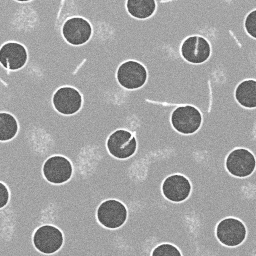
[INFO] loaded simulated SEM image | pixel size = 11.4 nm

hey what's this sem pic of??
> a regular array of holes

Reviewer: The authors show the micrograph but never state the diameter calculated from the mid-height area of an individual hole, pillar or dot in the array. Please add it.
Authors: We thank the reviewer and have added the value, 330 nm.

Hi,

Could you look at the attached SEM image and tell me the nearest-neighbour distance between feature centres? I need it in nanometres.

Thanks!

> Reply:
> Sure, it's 788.